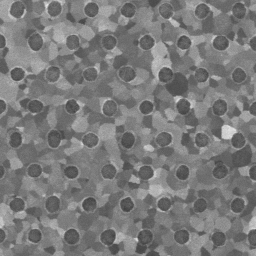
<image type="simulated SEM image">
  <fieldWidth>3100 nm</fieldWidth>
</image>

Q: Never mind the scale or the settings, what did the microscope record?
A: a regular array of holes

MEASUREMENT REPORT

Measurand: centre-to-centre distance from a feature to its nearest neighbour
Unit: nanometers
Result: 439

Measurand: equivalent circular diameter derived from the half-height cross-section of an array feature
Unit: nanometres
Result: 186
